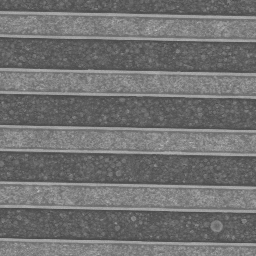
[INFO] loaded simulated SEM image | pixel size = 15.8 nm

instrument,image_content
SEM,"parallel lines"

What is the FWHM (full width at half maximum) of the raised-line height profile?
0.372 microns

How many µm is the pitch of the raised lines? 0.894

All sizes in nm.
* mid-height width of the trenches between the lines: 528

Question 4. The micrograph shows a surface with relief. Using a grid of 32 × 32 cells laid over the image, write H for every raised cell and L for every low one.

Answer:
LLLLLLLLLLLLLLLLLLLLLLLLLLLLLLLL
LLLLLLLLLLLLLLLLLLLLLLLLLLLLLLLL
HHHHHHHHHHHHHHHHHHHHHHHHHHHHHHHH
HHHHHHHHHHHHHHHHHHHHHHHHHHHHHHHH
LLLLHHHHHHHHHHHHHHHHHHHHHHHHHHHH
LLLLLLLLLLLLLLLLLLLLLLLLLLLLLLLL
LLLLLLLLLLLLLLLLLLLLLLLLLLLLLLLL
LLLLLLLLLLLLLLLLLLLLLLLLLLLLLLLL
LLLLLLLLLLLLLLLLLLLLLLLLLLLLLLLL
HHHHHHHHHHHHHHHHHHHHHHHHHHHHHHHH
HHHHHHHHHHHHHHHHHHHHHHHHHHHHHHHH
HHHHHHHHHHHHHHHHHHHHHHHHHHHHHHHH
LLLLLLLLLLLLLLLLLLLLLLLLLLLLLLLL
LLLLLLLLLLLLLLLLLLLLLLLLLLLLLLLL
LLLLLLLLLLLLLLLLLLLLLLLLLLLLLLLL
LLLLLLLLLLLLLLLLLLLLLLLLLLLLLLLL
HHHHHHHHHHHHHHHHHHHHHHHHHHHHHHHH
HHHHHHHHHHHHHHHHHHHHHHHHHHHHHHHH
HHHHHHHHHHHHHHHHHHHHHHHHHHHHHHHH
LLLLLLLLLLLLLLLLLLLLLLLLLLLLLLLL
LLLLLLLLLLLLLLLLLLLLLLLLLLLLLLLL
LLLLLLLLLLLLLLLLLLLLLLLLLLLLLLLL
LLLLLLLLLLLLLLLLLLLLLLLLLLLLLLLL
HHHHHHHHHHHHHHHHHHHHHHHHHHHHHHHL
HHHHHHHHHHHHHHHHHHHHHHHHHHHHHHHH
HHHHHHHHHHHHHHHHHHHHHHHHHHHHHHHH
LLLLLLLLLLLLLLLLLLLLLLLLLLLLLLLL
LLLLLLLLLLLLLLLLLLLLLLLLLLLLLLLL
LLLLLLLLLLLLLLLLLLLLLLLLLLLLLLLL
LLLLLLLLLLLLLLLLLLLLLLLLLLLLLLLL
HHHHHHHHHHHHHHHHHHHHHHHHLLLLLLLL
HHHHHHHHHHHHHHHHHHHHHHHHHHHHHHHH